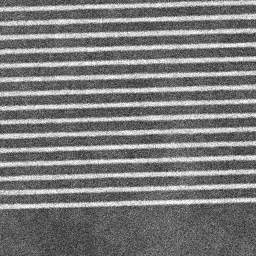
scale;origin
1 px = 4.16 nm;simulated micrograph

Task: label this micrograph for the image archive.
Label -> parallel lines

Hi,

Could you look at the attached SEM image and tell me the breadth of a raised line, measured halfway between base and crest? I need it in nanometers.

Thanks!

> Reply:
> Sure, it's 11.4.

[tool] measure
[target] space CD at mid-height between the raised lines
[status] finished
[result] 47.8 nm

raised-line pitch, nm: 58.6